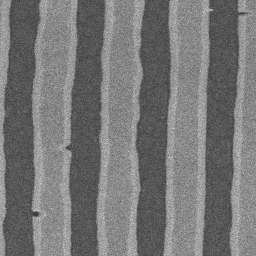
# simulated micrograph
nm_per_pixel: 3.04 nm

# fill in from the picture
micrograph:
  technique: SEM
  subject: one or a few lines or trenches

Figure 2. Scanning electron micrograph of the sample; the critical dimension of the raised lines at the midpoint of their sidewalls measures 92.6 nm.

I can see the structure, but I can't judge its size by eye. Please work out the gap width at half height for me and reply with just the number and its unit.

0.111 microns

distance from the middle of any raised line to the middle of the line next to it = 203 nm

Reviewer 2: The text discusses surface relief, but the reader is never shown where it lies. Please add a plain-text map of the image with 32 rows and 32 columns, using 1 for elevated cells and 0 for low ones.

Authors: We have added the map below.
10000011100000111000001111000011
10000111100000111000001111000001
10000111100000111000001111000011
10000111100000111000001111000011
10000111100000111000001111000011
10000111100001111000001111000011
10000111100001111000001111000011
00000111100001111000001111000011
00000111100001111000001110000011
00000111100001111000001110000011
00000111000001111000001110000011
00000111000001111000001110000011
00000111000001111000001110000011
00000111000001111000001110000011
00000111000001111000011110000011
00000111000001111000011110000011
00000111000001111000011110000011
00000111000001111000011110000011
00000111000001111000011110000011
00000111000001111000011110000011
00000111000001111000011110000011
00000111000001111000011110000011
00000111000001111000011110000011
00000111000001111000011110000111
00000111000001111000011110000111
00000111000001111000011110000111
00000111000001111000011110000011
00000111000001110000011110000011
00000111000001110000011110000111
00000111000001111000011110000111
00000111000001111000011110000111
00000111000001111000011110000111